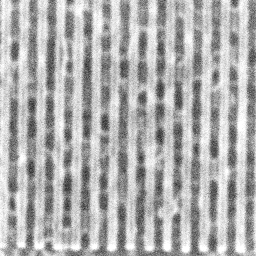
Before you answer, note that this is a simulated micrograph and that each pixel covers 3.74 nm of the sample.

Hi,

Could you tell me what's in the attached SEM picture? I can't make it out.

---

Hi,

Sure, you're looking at parallel lines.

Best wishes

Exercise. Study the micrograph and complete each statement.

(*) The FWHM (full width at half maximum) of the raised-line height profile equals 7.62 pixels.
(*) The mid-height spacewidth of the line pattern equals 39.8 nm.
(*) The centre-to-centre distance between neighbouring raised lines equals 68.3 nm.